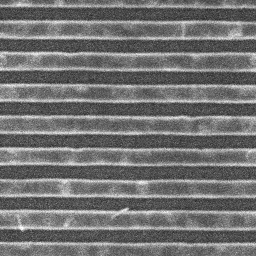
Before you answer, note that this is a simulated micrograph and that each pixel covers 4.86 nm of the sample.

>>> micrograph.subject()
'parallel lines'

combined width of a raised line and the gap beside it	0.154	micrometres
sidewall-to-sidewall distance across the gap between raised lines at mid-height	70.5	nanometers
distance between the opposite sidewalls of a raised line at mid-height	83.9	nanometres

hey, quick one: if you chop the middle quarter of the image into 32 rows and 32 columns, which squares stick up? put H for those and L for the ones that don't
HHHHHHHHHHHHHHHHHHHHHHHHHHHHHHHH
LLLLLLLLHHHHHHHHHHHLLLLLLLLLLHHH
LLLLLLLLLLLLLLLLLLLLLLLLLLLLLLLL
LLLLLLLLLLLLLLLLLLLLLLLLLLLLLLLL
LLLLLLLLLLLLLLLLLLLLLLLLLLLLLLLL
HHHHHHHHHHHHHHHHHHHHHHHLLLLLLLLH
HHHHHHHHHHHHHHHHHHHHHHHHHHHHHHHH
HHHHHHHHHHHHHHHHHHHHHHHHHHHHHHHH
HHHHHHHHHHHHHHHHHHHHHHHHHHHHHHHH
LLLLLLLLLLHHHLLLLLLLLLLLLLLLLLLL
LLLLLLLLLLLLLLLLLLLLLLLLLLLLLLLL
LLLLLLLLLLLLLLLLLLLLLLLLLLLLLLLL
LLLLLLLLLLLLLLLLLLLLLLLLLLLLLLLL
HHHHHHHHHHHHHHHHHHHHHHHHHHHHHHHH
HHHHHHHHHHHHHHHHHHHHHHHHHHHHHHHH
HHHHHHHHHHHHHHHHHHHHHHHHHHHHHHHH
HHHHHHHHHHHHHHHHHHHHHHHHHHHHHHHH
LLLLLLLLLLLLLLLLLLHLLLLLLLLLLHHH
LLLLLLLLLLLLLLLLLLLLLLLLLLLLLLLL
LLLLLLLLLLLLLLLLLLLLLLLLLLLLLLLL
LLLLLLLLLLLLLLLLLLLLLLLLLLLLLLLL
HHHHHHHHHHHHHHHHHHHHHHHHHHHHHHHH
HHHHHHHHHHHHHHHHHHHHHHHHHHHHHHHH
HHHHHHHHHHHHHHHHHHHHHHHHHHHHHHHH
HHHHHHHHHHHHHHHHHHHHHHHHHHHHHHHH
LLLLLLLLLLLLLLLLLLLLLLLLLLLLLLLL
LLLLLLLLLLLLLLLLLLLLLLLLLLLLLLLL
LLLLLLLLLLLLLLLLLLLLLLLLLLLLLLLL
LLLLLLLLLLLLLLLLLLLLLLLLLLLLLLLL
HHHHHHHHHHHHHHHHLLHHHHHHHHHHHHHH
HHHHHHHHHHHHHHHHHHHHHHHHHHHHHHHH
HHHHHHHHHHHHHHHHHHHHHHHHHHHHHHHH